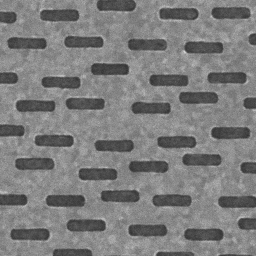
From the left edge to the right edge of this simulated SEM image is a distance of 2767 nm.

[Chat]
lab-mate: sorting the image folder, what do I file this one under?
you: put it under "a regular array of holes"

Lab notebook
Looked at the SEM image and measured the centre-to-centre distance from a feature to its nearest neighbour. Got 373 nm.